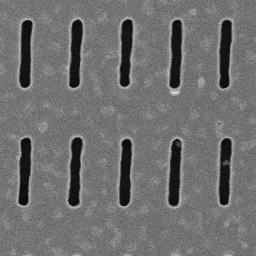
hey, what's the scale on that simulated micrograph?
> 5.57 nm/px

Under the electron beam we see a regular array of holes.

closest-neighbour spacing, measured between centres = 278 nm